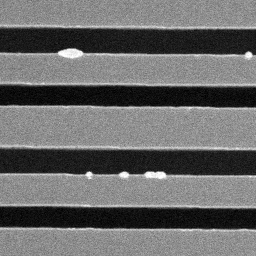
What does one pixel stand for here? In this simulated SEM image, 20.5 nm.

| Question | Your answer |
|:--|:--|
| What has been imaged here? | lines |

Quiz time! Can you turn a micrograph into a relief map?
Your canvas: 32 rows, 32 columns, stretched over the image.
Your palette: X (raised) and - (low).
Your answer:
XXXXXXXXXXXXXXXXXXXXXXXXXXXXXXXX
XXXXXXXXXXXXXXXXXXXXXXXXXXXXXXXX
XXXXXXXXXXXXXXXXXXXXXXXXXXXXXXXX
--------------------------------
--------------------------------
--------------------------------
-------XXX----------------------
XXXXXXXXXXXXXXXXXXXXXXXXXXXXXXXX
XXXXXXXXXXXXXXXXXXXXXXXXXXXXXXXX
XXXXXXXXXXXXXXXXXXXXXXXXXXXXXXXX
--XXXXXXXXXXXXXXXXXXXXXXXXXXXXXX
--------------------------------
--------------------------------
XXXXXXXXXXXXXXXXXXXXXXXXXXX-----
XXXXXXXXXXXXXXXXXXXXXXXXXXXXXXXX
XXXXXXXXXXXXXXXXXXXXXXXXXXXXXXXX
XXXXXXXXXXXXXXXXXXXXXXXXXXXXXXXX
XXXXXXXXXXXXXXXXXXXXXXXXXXXXXXXX
-------------XXXXXXXXXXXXXXXXXXX
--------------------------------
--------------------------------
--------------------------------
XXXXXXXXXXXXXXXXXXXXXXXXXXXXXXXX
XXXXXXXXXXXXXXXXXXXXXXXXXXXXXXXX
XXXXXXXXXXXXXXXXXXXXXXXXXXXXXXXX
XXXXXXXXXXXXXXXXXXXXXXXXXXXXXXXX
--------------------------------
--------------------------------
--------------------------------
XXXXXXXXXXXXXXXXXXXXXXXXXXXXXXXX
XXXXXXXXXXXXXXXXXXXXXXXXXXXXXXXX
XXXXXXXXXXXXXXXXXXXXXXXXXXXXXXXX